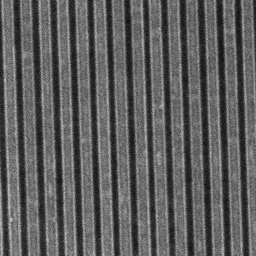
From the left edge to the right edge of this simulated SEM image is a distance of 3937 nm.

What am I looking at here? parallel lines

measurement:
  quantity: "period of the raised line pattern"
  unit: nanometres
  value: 283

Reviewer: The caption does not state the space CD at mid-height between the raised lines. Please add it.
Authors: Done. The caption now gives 0.144 microns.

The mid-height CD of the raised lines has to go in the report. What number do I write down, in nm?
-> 144